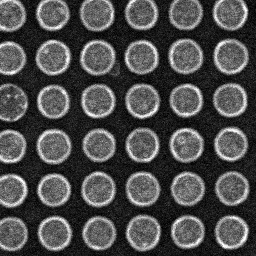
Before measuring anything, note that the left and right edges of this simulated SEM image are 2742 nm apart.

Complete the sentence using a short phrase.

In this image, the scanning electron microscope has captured a regular array of raised bodies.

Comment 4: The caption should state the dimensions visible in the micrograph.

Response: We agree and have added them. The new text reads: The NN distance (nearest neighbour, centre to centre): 468 nanometres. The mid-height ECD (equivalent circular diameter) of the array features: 0.348 µm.